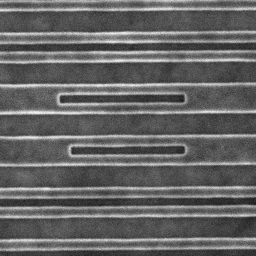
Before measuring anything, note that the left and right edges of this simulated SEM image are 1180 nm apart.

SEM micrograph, groups of lines, slits or small figures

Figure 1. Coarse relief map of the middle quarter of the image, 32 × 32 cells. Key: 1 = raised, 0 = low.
00000000000000000000000000000000
00000000000000000000000000000000
00000000000000000000000000000000
00000000000000000000000000000000
00000000000000000000000000000000
11111111111111111111111111111111
11111111111111111111111111111111
00000000000000000000000000000011
00000000000000000000000000000011
00000000000000000000000000000011
11111111111111111111111111111111
11111111111111111111111111111111
00000000000000000000000000000000
00000000000000000000000000000000
00000000000000000000000000000000
00000000000000000000000000000000
00000000000000000000000000000000
00000000000000000000000000000000
11111111111111111111111111111111
11111111111111111111111111111111
11111111111111111111110000000011
10000000000000000000000000000011
11000000000000000000000000000011
11111111111111111111111111111111
11111111111111111111111111111111
00000000000000000000000000000000
00000000000000000000000000000000
00000000000000000000000000000000
00000000000000000000000000000000
00000000000000000000000000000000
00000000000000000000000000000000
11111111111111111111111111111111